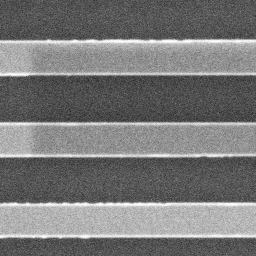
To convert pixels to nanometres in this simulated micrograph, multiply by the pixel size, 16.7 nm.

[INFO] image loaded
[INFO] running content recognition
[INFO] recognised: lines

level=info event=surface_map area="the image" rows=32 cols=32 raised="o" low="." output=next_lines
................................
................................
................................
................................
................................
oooooooooooooooooooooooooooooooo
oooooooooooooooooooooooooooooooo
oooooooooooooooooooooooooooooooo
oooooooooooooooooooooooooooooooo
................................
................................
................................
................................
................................
................................
oooooooooooooooooooooooooooooooo
oooooooooooooooooooooooooooooooo
oooooooooooooooooooooooooooooooo
oooooooooooooooooooooooooooooooo
oooooooooooooooooooooooooooo....
................................
................................
................................
................................
................................
.ooo.oooooo.oooooooooooooooooooo
oooooooooooooooooooooooooooooooo
oooooooooooooooooooooooooooooooo
oooooooooooooooooooooooooooooooo
oooooooooooooooooooooooooooooooo
................................
................................